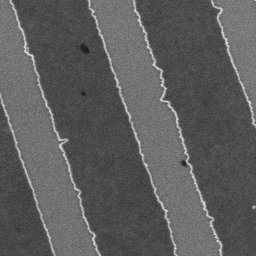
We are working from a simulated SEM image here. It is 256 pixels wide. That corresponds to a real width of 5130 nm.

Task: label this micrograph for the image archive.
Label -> one or a few lines or trenches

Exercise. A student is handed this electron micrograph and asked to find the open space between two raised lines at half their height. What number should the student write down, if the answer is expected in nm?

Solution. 818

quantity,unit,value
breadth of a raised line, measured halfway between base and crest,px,74.3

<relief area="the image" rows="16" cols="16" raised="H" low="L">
LHHHHHLLHHHHHHLL
LHHHHHLLLHHHHHLL
LLHHHHLLLHHHHHLL
LLHHHHHLLLHHHHLL
LLHHHHHLLLHHHHHL
LLLHHHHLLLHHHHHL
LLLHHHHHLLHHHHHH
HLLHHHHHLLLHHHHH
HLLLHHHHHLLHHHHH
HLLLHHHHHLLLHHHH
HHLLHHHHHLLLHHHH
HHLLLHHHHHLLHHHH
HHLLLHHHHHLLLHHH
HHHLLHHHHHLLLHHH
HHHLLLHHHHHLLHHH
HHHLLLHHHHHLLLHH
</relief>